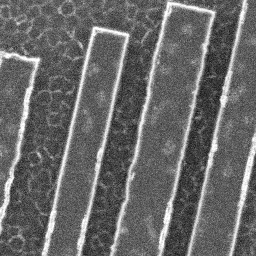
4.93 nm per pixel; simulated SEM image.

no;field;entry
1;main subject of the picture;one or a few lines or trenches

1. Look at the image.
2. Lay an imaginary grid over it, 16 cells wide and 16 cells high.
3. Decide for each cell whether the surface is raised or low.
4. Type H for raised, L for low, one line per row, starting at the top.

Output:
LLLLLLLLLLLHLLLH
LLLLLLLLLLHHHLLH
LLLLLLHHLLHHHLLH
HLLLLHHHLLHHHLLH
HHLLLHHLLHHHHLHH
HHLLLHHLLHHHLLHH
HHLLLHHLLHHHLLHH
HHLLLHHLLHHHLLHH
HLLLHHHLLHHHLHHH
HLLLHHLLLHHLLHHH
HLLLHHLLHHHLLHHH
HLLLHHLLHHHLLHHL
HLLHHHLLHHHLLHHL
LLLHHLLLHHHLHHHL
LLLHHLLHHHLLHHHL
LLLHHLLHHHLLHHHL